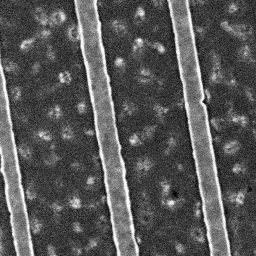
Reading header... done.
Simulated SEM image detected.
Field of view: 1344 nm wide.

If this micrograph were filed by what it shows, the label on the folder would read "one or a few lines or trenches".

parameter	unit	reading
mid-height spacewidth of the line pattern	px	73.4